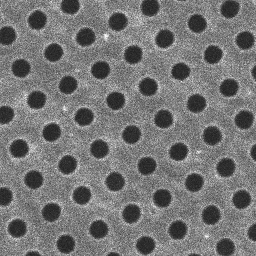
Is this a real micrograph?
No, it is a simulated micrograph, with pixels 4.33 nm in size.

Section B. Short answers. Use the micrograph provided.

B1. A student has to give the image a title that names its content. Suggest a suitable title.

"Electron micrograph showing a regular array of holes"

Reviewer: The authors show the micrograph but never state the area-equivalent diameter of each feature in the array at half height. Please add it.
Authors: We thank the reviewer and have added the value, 78.6 nanometers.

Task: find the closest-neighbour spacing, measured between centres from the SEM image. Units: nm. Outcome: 152